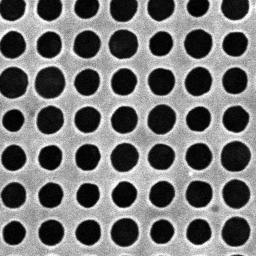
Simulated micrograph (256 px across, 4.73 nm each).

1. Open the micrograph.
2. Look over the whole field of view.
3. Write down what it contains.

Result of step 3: a regular array of holes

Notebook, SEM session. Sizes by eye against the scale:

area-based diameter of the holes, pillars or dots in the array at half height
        123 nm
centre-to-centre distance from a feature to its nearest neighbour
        36.8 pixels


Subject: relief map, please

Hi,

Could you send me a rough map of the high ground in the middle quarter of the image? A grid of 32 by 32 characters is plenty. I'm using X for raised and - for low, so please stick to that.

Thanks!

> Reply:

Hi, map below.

XXXXXXXXXXXXXXXXXXXXXXXXXXXXXXXX
XXXXX--XXXXXXX---XXXXX----XXXXXX
XXX------XXXX----XXXXX-----XXXX-
XXX------XXX------XXX-------XX--
XXX------XXX------XXX-------XX--
XXX------XXX------XXX-------XX--
XXX-----XXXX-----XXXXX-----XXXX-
XXXX---XXXXXX---XXXXXXX---XXXXX-
XXXXXXXXXXXXXXXXXXXXXXXXXXXXXXXX
XXXXXXXXXXXXXXXXXXXXXXXXXXXXXXXX
XXXXXXXXXXXXXX--XXXXXXX---XXXXXX
XXXX----XXXXX-----XXXX-----XXXXX
XXX------XXX------XXX-------XXX-
XXX------XXX------XXX-------XX--
XXX------XXX------XXX-------XXX-
XXX------XXX------XXX------XXXX-
XXXX----XXXXX----XXXXX-----XXXXX
XXXXXXXXXXXXXXXXXXXXXXX--XXXXXXX
XXXXXXXXXXXXXXXXXXXXXXXXXXXXXXXX
XXXXXXXXXXXXXXXXXXXXXXXXXXXXXXXX
XXXX----XXXXX----XXXXX----XXXXXX
XXX------XXX------XXX------XXXX-
XXX------XXX-------XX-------XX--
XXX------XXX-------XX-------XX--
XXX------XXX------XXX------XXXX-
XXX-----XXXX------XXXX-----XXXX-
XXXXX--XXXXXX---XXXXXXXX-XXXXXXX
XXXXXXXXXXXXXXXXXXXXXXXXXXXXXXXX
XXXXXXXXXXXXXXXXXXXXXXXXXXXXXXXX
XXXXXXXXXXXXXX--XXXXXXX---XXXXXX
XXXX----XXXXX----XXXXX-----XXXX-
XXX------XXX------XXXX-----XXXX-